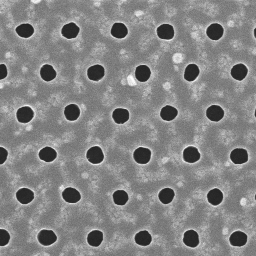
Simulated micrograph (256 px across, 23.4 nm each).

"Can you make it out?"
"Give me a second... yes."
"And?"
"a regular array of holes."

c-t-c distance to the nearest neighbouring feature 1090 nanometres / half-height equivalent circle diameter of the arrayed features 400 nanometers